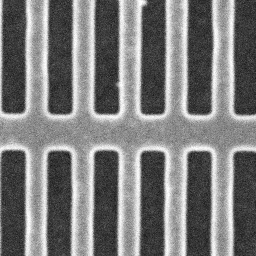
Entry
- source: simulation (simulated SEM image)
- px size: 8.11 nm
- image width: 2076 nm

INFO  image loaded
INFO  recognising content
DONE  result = groups of lines, slits or small figures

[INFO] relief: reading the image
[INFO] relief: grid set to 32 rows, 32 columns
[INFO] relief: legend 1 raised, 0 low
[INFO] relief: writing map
00011100011100011100011000011000
00011100011100011100011000011000
00001100011100011100011000011000
00011100011100011100011000011000
00011100011100011100011000011000
00011100011100011100011000011000
00011100011100011100011000011000
00011100011100011100011000011000
00011100011100011100011000011000
00011100011100011100011000011000
00011100011100011100011000011000
00011100011100011000011000011000
00011100011100011000011000011000
00011100011100011000011000011000
11111110111110111100111100111100
11111111111111111111111111111111
11111111111111111111111111111111
11111111111111111111111111111111
11111111111111111111111111111111
00011100011100011100011000011000
00011100011100011000011000011000
00011100011100011000011000011000
00011100011100011000011000011000
00011100011100011000011000011000
00011100011100011000011000011000
00011100011100011000011000011000
00011100011000011000011000011000
00011100011000011000011000011000
00011100011000011000011000111000
00011100011000011000011000111000
00011100011000011000011000111000
00011100011000011000011000011000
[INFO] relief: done